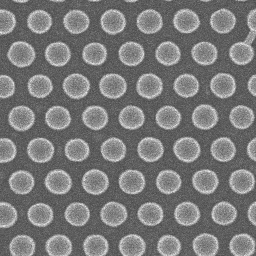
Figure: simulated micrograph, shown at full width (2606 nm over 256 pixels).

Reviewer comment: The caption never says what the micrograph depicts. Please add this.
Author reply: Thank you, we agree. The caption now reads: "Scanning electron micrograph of a regular array of raised bodies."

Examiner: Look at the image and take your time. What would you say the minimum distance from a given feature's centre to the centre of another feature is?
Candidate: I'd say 370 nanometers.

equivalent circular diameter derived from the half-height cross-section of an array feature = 241 nm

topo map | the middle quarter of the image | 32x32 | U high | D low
DDDDDDDDDDDDDDDDDDDDDDDDDDDDDDDD
DDDDDDDDDDDDDDDDDDDDDDDDDDDDDDDD
DDDDDDDDDDDDDDDDDDDDDDDDDDDDDDDD
DUUUUDDDDDUUUUUDDDDUUUUDDDDDDUUU
UUUUUUDDDUUUUUUDDDDUUUUUDDDDUUUU
UUUUUUDDDUUUUUUDDDDUUUUUDDDDUUUU
UUUUUUDDDUUUUUUDDDDUUUUUDDDDUUUU
DUUUUUDDDDUUUUUDDDDUUUUUDDDDDUUU
DDDDDDDDDDDDUDDDDDDDDDDDDDDDDDDD
DDDDDDDDDDDDDDDDDDDDDDDDDDDDDDDD
DDDDDDDDDDDDDDDDUDDDDDDDDDDDDDDD
UDDDDDUUUUDDDDDUUUUDDDDDUUUUDDDD
UDDDDUUUUUUDDDUUUUUUDDDUUUUUUDDD
UDDDDUUUUUUDDDUUUUUUDDDUUUUUUDDD
UDDDDUUUUUDDDDUUUUUUDDDUUUUUUDDD
UDDDDDUUUUDDDDDUUUUDDDDDUUUUDDDD
DDDDDDDDDDDDDDDDDDDDDDDDDDDDDDDD
DDDDDDDDDDDDDDDDDDDDDDDDDDDDDDDD
DDDDDDDDDDDDDDDDDDDDDDDDDDDDDDDD
DUUUUDDDDDUUUUDDDDDUUUUUDDDDUUUU
UUUUUUDDDDUUUUUDDDDUUUUUDDDDUUUU
UUUUUUDDDDUUUUUDDDDUUUUUDDDDUUUU
UUUUUUDDDDUUUUUDDDDUUUUUDDDDUUUU
DUUUUDDDDDUUUUDDDDDDUUUUDDDDDUUU
DDDDDDDDDDDDDDDDDDDDDDDDDDDDDDDD
DDDDDDDDDDDDDDDDDDDDDDDDDDDDDDDD
DDDDDDDUUDDDDDDDDDDDDDDDDDDDDDDD
UDDDDUUUUUDDDDDUUUUDDDDDUUUUDDDD
UDDDDUUUUUUDDDUUUUUUDDDDUUUUUDDD
UUDDDUUUUUUDDDUUUUUUDDDUUUUUUDDD
UDDDDUUUUUUDDDUUUUUUDDDUUUUUUDDD
UDDDDUUUUUDDDDDUUUUDDDDDUUUUDDDD